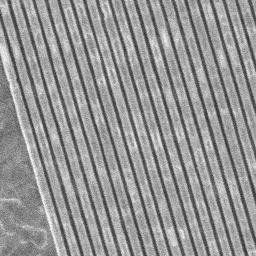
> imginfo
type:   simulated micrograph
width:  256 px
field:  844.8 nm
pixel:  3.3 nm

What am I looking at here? parallel lines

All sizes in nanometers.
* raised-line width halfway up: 28.1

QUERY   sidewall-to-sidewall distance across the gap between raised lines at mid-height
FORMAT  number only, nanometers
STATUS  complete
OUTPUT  12.7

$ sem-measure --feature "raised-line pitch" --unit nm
40.1